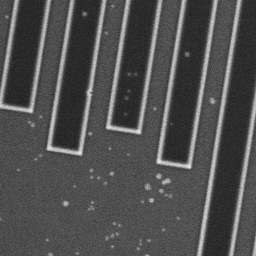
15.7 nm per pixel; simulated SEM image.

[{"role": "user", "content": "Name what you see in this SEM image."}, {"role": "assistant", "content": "parallel lines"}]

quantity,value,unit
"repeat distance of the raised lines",856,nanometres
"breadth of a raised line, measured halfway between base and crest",32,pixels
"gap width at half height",356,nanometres